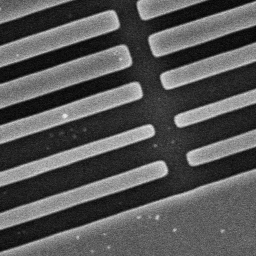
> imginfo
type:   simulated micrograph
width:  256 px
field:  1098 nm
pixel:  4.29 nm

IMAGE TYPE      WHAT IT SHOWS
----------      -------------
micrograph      groups of lines, slits or small figures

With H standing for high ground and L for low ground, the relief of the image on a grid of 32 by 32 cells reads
HHHHHHHLLLLLLLLLLHHHHHHHLLLLLLLH
HHHHHLLLLLLLLHLLLHHHHLLLLLLLHHHH
HLLLLLLLLLHHHHHLLLLLLLLLHHHHHHHH
LLLLLLLHHHHHHHHLLLLLLLHHHHHHHHHL
LLLLHHHHHHHHLLLLLLLHHHHHHHHHLLLL
LHHHHHHHHLLLLLLLLLLHHHHHHLLLLLLH
HHHHHHLLLLLLHHHHLLLHHHLLLLLLHHHH
HHHLLLLLLHHHHHHHLLLLLLLLLHHHHHHH
LLLLLLHHHHHHHHHHLLLLLLHHHHHHHHLL
LLLHHHHHHHHHHLLLLLLLHHHHHHLLLLLL
HHHHHHHHHHLLLLLLHLLLHHHLLLLLLLLL
HHHHHHLLLLLLLHHHHHLLLLLLLLLLLLLH
HHHLLLLLLLHHHHHHHLLLLLLLLLLLHHHH
LLLLLLLHHHHHHHLLLLLLLLLLLHHHHHLL
LLLLHHHHHHHLLLLLLLLLLLHHHHHLLLLL
LHHHHHHHLLLLLLLLLLLLLLHHLLLLLLLL
HHHHHLLLLLLLLLLLHHHLLLLLLLLLLLLH
HHLLLLLLLLLLLHHHHHLLLLLLLLLLHHHH
LLLLLLLLLHHHHHHLLLLLLLLLLHHHHHHL
LLLLLLHHHHHHLLLLLLLLLLLLHHHHLLLL
LLLHHHHHLLLLLLLLLLLHHLLLHLLLLLLL
HHHHHHLLLLLLLLLLHHHHHLLLLLLLLLLH
HHLLLLLLLLLLLHHHHHHLLLLLLLLLHHHH
LLLLLLLLLLHHHHHHLLLLLLLLLHHHHHHH
LLLLLLLHHHHHHLLLLLLLLLHHHHHHHHHH
LLLHHHHHHHLLLLLLLLHHHHHHHHHHHHHH
LHHHHHHLLLLLLLLHHHHHHHHHHHHHHHHH
HHHHLLLLLLLLHHHHHHHHHHHHHHHHHHHH
HLLLLLLLLLHHHHHHHHHHHHHHHHHHHHHH
LLLLLLHHHHHHHHHHHHHHHHHHHHHHHHHH
LLLHHHHHHHHHHHHHHHHHHHHHHHHHHHHH
HHHHHHHHHHHHHHHHHHHHHHHHHHHHHHHH